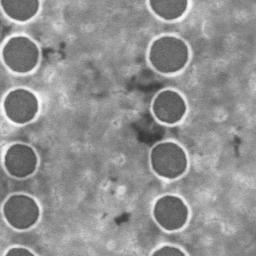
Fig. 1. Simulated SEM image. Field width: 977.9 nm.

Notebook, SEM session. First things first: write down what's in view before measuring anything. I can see a regular array of holes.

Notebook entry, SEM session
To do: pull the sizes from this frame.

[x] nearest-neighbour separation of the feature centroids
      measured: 0.198 µm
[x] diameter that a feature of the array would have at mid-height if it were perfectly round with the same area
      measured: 137 nanometers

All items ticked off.